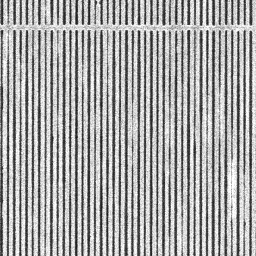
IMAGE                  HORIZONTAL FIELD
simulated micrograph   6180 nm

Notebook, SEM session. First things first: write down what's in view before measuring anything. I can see parallel lines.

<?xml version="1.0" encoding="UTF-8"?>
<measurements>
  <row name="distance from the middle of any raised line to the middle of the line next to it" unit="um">0.15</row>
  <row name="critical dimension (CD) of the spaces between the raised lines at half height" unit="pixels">2.87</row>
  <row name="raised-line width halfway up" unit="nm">93.5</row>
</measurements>